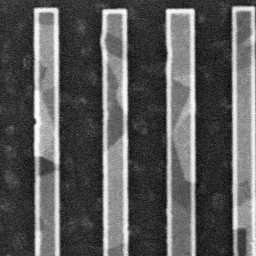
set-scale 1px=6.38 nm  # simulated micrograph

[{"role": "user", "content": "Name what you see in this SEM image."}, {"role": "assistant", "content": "one or a few lines or trenches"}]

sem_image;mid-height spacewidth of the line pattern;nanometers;276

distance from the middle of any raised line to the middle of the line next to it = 420 nanometres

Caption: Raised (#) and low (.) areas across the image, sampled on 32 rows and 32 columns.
................................
.....##......##......###.....###
.....##......###.....###.....###
.....##......###.....###.....###
.....##......###.....###.....###
.....##......###.....###.....###
.....##......###.....###.....###
.....##......###.....###.....###
.....##......###.....###.....###
.....##......###.....###.....###
.....##......###.....###.....###
.....##......###.....###.....###
.....##......###.....###.....###
.....##......###.....###.....###
.....##......###.....###.....###
.....##......###.....###.....###
.....##......###.....###.....###
.....##......###.....###.....###
.....##......###.....###.....###
.....##......###.....###.....###
.....##......###.....###.....###
.....##......###.....###.....###
.....##......###.....###.....###
.....##......###.....###.....###
.....##......###.....###.....###
.....##......###.....###.....###
.....##......###.....###.....###
.....##......###.....###.....###
.....##......###.....###.....###
.....##......###.....###.....###
.....##......###.....###.....###
.....##......###.....###.....###